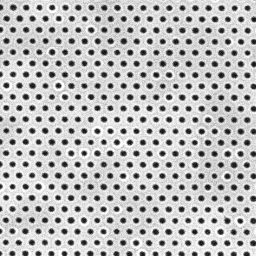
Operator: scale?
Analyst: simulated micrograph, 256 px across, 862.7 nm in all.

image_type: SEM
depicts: a regular array of holes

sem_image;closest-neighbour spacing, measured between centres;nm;42.7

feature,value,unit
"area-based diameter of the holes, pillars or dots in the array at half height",20.8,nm